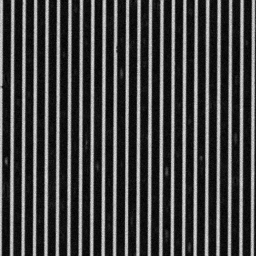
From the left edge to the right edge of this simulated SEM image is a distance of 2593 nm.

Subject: parallel lines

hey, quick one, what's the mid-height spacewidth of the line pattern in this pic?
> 86.8 nm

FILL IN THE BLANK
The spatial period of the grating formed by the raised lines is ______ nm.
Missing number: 116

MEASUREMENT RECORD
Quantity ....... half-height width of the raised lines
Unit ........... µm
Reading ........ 0.0291